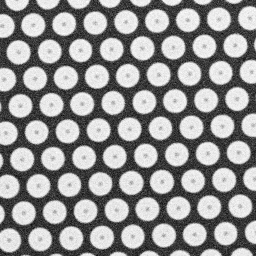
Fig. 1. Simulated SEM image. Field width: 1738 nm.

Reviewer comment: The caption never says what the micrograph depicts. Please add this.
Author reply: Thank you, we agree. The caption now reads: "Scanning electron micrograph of an array of small figures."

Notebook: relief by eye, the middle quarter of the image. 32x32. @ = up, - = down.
-------@@------@@-----@@@@---@@@
@@@---@@@@@---@@@@---@@@@@---@@@
@@@--@@@@@@--@@@@@@--@@@@@---@@@
@@@--@@@@@@--@@@@@@--@@@@@---@@@
@@@---@@@@@--@@@@@---@@@@@---@@@
@@-----@@@-----@@---------------
---------------------------@----
---@@@-----@@@----@@@@----@@@@--
--@@@@@---@@@@@--@@@@@@--@@@@@--
--@@@@@---@@@@@--@@@@@@--@@@@@@-
--@@@@@---@@@@@--@@@@@@--@@@@@--
--@@@@@---@@@@----@@@@----@@@@--
---@@@--------------------------
-----------------------@@-----@@
@@@----@@@@---@@@@@---@@@@---@@@
@@@---@@@@@---@@@@@--@@@@@@--@@@
@@@@--@@@@@---@@@@@--@@@@@@--@@@
@@@@--@@@@@---@@@@@---@@@@@---@@
@@@----@@@@----@@@-----@@@-----@
@@------------------------------
------------@@-----@@@-----@@@--
---@@@@----@@@@---@@@@@---@@@@@-
--@@@@@@--@@@@@---@@@@@--@@@@@@-
--@@@@@@--@@@@@---@@@@@---@@@@@-
--@@@@@@--@@@@@---@@@@@---@@@@--
---@@@@----@@@-----@@@----------
--------------------------------
@@------@@-----@@@@---@@@@@---@@
@@@@---@@@@@--@@@@@---@@@@@---@@
@@@@--@@@@@@--@@@@@@--@@@@@---@@
@@@@--@@@@@@--@@@@@@--@@@@@---@@
@@@@---@@@@@---@@@@---@@@@@---@@